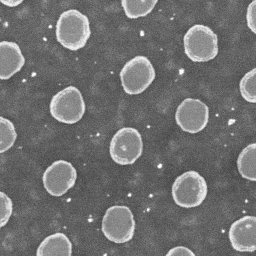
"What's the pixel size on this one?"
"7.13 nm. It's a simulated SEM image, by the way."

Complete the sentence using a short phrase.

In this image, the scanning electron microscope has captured a regular array of raised bodies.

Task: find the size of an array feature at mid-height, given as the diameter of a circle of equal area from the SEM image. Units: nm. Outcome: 236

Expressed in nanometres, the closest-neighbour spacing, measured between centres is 508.